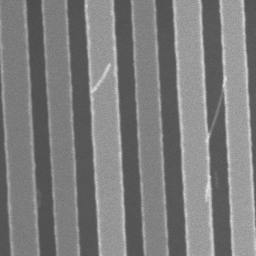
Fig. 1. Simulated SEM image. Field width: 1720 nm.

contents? lines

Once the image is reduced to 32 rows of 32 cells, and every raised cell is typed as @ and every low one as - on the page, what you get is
@@@--@@@---@@@--@@@---@@@---@@--
@@@--@@@---@@@---@@---@@@---@@@-
@@@--@@@---@@@---@@---@@@---@@@-
@@@--@@@---@@@---@@@--@@@---@@@-
@@@---@@@--@@@---@@@--@@@---@@@-
@@@@--@@@--@@@---@@@--@@@---@@@-
@@@@--@@@--@@@@--@@@--@@@---@@@-
@@@@--@@@--@@@@--@@@--@@@---@@@-
@@@@--@@@--@@@@--@@@--@@@@--@@@-
@@@@--@@@--@@@@--@@@--@@@@--@@@-
@@@@--@@@--@@@@--@@@--@@@@--@@@-
@@@@--@@@--@@@@--@@@--@@@@--@@@-
@@@@--@@@--@@@@--@@@--@@@@--@@@-
@@@@--@@@--@@@@--@@@--@@@@--@@@-
@@@@--@@@--@@@@--@@@--@@@@--@@@-
-@@@--@@@---@@@--@@@--@@@@--@@@-
-@@@--@@@---@@@--@@@--@@@@--@@@-
-@@@--@@@---@@@--@@@---@@@--@@@-
-@@@--@@@---@@@--@@@---@@@--@@@-
-@@@--@@@---@@@--@@@---@@@--@@@-
-@@@--@@@---@@@--@@@---@@@--@@@@
-@@@--@@@---@@@--@@@@--@@@--@@@@
-@@@--@@@---@@@---@@@--@@@---@@@
-@@@@--@@@--@@@---@@@--@@@---@@@
-@@@@--@@@--@@@---@@@--@@@---@@@
-@@@@--@@@--@@@@--@@@--@@@---@@@
-@@@@--@@@--@@@@--@@@--@@@---@@@
-@@@@--@@@--@@@@--@@@--@@@@--@@@
-@@@@--@@@--@@@@--@@@--@@@@--@@@
-@@@@--@@@--@@@@--@@@--@@@@--@@@
-@@@@--@@@--@@@@--@@@--@@@@--@@@
-@@@@--@@@--@@@@--@@@--@@@@--@@@